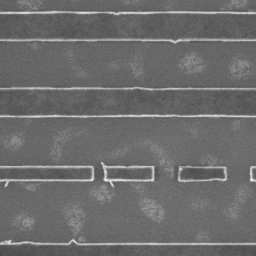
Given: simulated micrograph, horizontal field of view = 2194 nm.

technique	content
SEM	one or a few lines or trenches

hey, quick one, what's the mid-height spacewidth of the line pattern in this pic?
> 50.4 px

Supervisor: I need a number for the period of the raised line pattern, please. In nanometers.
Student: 638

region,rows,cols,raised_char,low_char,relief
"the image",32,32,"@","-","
--------------------------------
--------------------------------
@@@@@@@@@@@@@@@@@@@@@@@@@@@@@@@@
@@@@@@@@@@@@@@@@@@@@@@@@@@@@@@@@
@@@@@@@@@@@@@@@@@@@@@@@@@@@@@@@@
--------------------------------
--------------------------------
--------------------------------
--------------------------------
--------------------------------
--------------------------------
@@@@@@@@@@@@@@@@@@@@@@@@@@@@@@@@
@@@@@@@@@@@@@@@@@@@@@@@@@@@@@@@@
@@@@@@@@@@@@@@@@@@@@@@@@@@@@@@@@
@@@@@@@@@@@@@@@@@@@@@@@@@@@@@@@@
--------------------------------
--------------------------------
--------------------------------
--------------------------------
--------------------------------
--------------------------------
@@@@@@@@@@@@-@@@@@@---@@@@@@---@
@@@@@@@@@@@--@@@@@@---@@@@@@----
--------------------------------
--------------------------------
--------------------------------
--------------------------------
--------------------------------
--------------------------------
--------------------------------
-@@@@---@@----------------------
@@@@@@@@@@@@@@@@@@@@@@@@@@@@@@@@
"